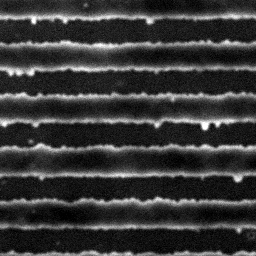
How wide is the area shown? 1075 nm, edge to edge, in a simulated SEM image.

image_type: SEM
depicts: lines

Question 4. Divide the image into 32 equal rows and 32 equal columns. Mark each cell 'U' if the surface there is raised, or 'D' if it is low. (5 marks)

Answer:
UUUUUUUUUUUUUUUUUUUUUUUUUUUUUUUU
UUUUUUUUUUUUUUUUUUUUUUUUUUUUUUUU
DDDDUDDDUDDDDDDDDDUUDDDDDDDDDDDD
DDDDDDDDDDDDDDDDDDDDDDDDDDDDDDDD
DDDDDDDDDDDDDDDDDDDDDDDDDDDDDDDD
UDUUUUUUUUDDUDDDUUUUUUUUUUUUUUUU
UUUUUUUUUUUUUUUUUUUUUUUUUUUUUUUU
UUUUUUUUUUUUUUUUUUUUUUUUUUUUUUUU
UUUUUUUUUUUUUUUUUUUUUUUUUUUUUUUU
DDDDDDDDDDDDDDDDDDDDDDDDDDDDDDDD
DDDDDDDDDDDDDDDDDDDDDDDDDDDDDDDD
DDDDDDDDDDDDDDDDDDDDDDDDDDDDDDDD
UUUUUUUUUUUUUUUUUUUUUUUUUUUUUUUU
UUUUUUUUUUUUUUUUUUUUUUUUUUUUUUUU
UUUUUUUUUUUUUUUUUUUUUUUUUUUUUUUU
UDDDUDDDDDDDDDDDDDDUDDDDDUDUDDDD
DDDDDDDDDDDDDDDDDDDDDDDDDDDDDDDD
DDDDDDDDDDDDDDDDDDDDDDDDDDDDDDDD
UUUDUUDUUDDUUUUUUUUUUUUUUUUUUUUU
UUUUUUUUUUUUUUUUUUUUUUUUUUUUUUUU
UUUUUUUUUUUUUUUUUUUUUUUUUUUUUUUU
UUUUUUUUUUUUUUUUUUUUUUUUUUUUUUUU
DDDDDDDDDDDDDDDDDDDDDDDDDDDDDDDD
DDDDDDDDDDDDDDDDDDDDDDDDDDDDDDDD
DDDDDDDDDDDDDDDDDDDDDDDDDDDDDDDD
UUUUUUUUUUUUUUUUUUUUUUUUUUUUUUUU
UUUUUUUUUUUUUUUUUUUUUUUUUUUUUUUU
UUUUUUUUUUUUUUUUUUUUUUUUUUUUUUUU
DDUUUDUUDDDUUUUUDDDDDDUDUDDDDUUD
DDDDDDDDDDDDDDDDDDDDDDDDDDDDDDDD
DDDDDDDDDDDDDDDDDDDDDDDDDDDDDDDD
DUDDDDDDDDDUDDDDDDDDDDDDDDDDDDUD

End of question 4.